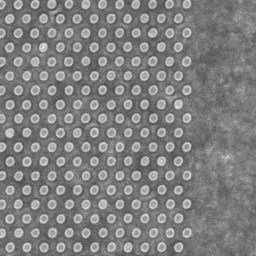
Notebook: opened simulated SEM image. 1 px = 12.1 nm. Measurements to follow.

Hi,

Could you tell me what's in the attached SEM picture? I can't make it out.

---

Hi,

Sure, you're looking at a regular array of raised bodies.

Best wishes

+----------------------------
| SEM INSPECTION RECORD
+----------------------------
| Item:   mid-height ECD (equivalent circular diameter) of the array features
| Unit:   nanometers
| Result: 100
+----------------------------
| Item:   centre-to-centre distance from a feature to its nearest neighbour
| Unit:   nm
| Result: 198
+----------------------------